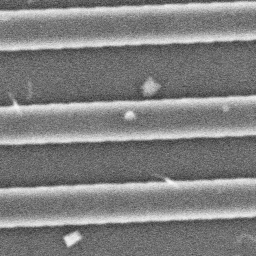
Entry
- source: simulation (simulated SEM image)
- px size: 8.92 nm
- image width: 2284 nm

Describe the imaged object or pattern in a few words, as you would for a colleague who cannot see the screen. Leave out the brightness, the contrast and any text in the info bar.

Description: lines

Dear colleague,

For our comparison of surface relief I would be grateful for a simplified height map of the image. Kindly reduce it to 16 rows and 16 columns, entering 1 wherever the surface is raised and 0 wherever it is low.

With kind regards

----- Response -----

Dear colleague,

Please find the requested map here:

0000011111111111
1111111111111111
1111111111111110
0000000000000000
0000000000000000
0000000000000000
0000111111111111
1111111111111111
1111111111111100
0000000000000000
0000000000000000
0000000111111111
1111111111111111
1111111111111111
0000000000000000
0000000000000000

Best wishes